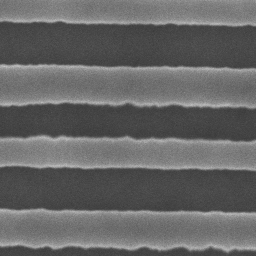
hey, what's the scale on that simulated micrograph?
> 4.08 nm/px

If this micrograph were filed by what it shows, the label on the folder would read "lines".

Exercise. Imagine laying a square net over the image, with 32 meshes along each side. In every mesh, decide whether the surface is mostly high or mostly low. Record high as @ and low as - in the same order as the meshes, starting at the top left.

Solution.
@@@@@@@@@@@@@@@@@@@@@@@@@@@@@@@@
@@@@@@@@@@@@@@@@@@@@@@@@@@@@@@@@
@@@@@@@@@@@@@@@@@@@@@@@@@@@@@@@@
--------------------------------
--------------------------------
--------------------------------
--------------------------------
--------------------------------
@@@@@@@@@@@@@@@@@@@@@@@@-@------
@@@@@@@@@@@@@@@@@@@@@@@@@@@@@@@@
@@@@@@@@@@@@@@@@@@@@@@@@@@@@@@@@
@@@@@@@@@@@@@@@@@@@@@@@@@@@@@@@@
@@@@@@@@@@@@@@@@@@@@@@@@@@@@@@@@
--------------------------------
--------------------------------
--------------------------------
--------------------------------
@@@@@@@@@@@@@@@@@-@@-@----------
@@@@@@@@@@@@@@@@@@@@@@@@@@@@@@@@
@@@@@@@@@@@@@@@@@@@@@@@@@@@@@@@@
@@@@@@@@@@@@@@@@@@@@@@@@@@@@@@@@
--------------------------------
--------------------------------
--------------------------------
--------------------------------
--------------------------------
@@@@@@@@@@@@@@@@@@@@-@@@@-@@----
@@@@@@@@@@@@@@@@@@@@@@@@@@@@@@@@
@@@@@@@@@@@@@@@@@@@@@@@@@@@@@@@@
@@@@@@@@@@@@@@@@@@@@@@@@@@@@@@@@
@@@@@@@@@@@@@@@@@@@@@@@@@@@@@@@@
--------------------------------